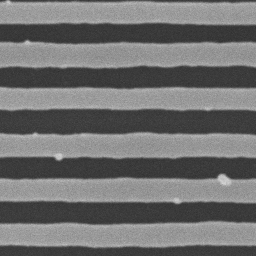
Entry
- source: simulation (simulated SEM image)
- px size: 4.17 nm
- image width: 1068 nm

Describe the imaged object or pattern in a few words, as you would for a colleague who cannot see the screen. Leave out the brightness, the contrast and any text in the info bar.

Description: lines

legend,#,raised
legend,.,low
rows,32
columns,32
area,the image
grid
################################
################################
################################
................................
................................
#######......#######.###########
################################
################################
................................
................................
................................
################################
################################
################################
................................
................................
................................
################################
################################
################################
................................
................................
################################
################################
################################
................................
................................
................................
################################
################################
################################
................................